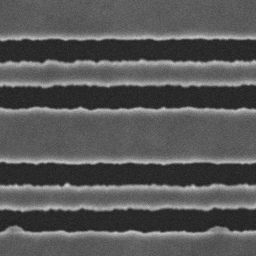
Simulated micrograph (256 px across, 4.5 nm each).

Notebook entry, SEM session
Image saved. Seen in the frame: lines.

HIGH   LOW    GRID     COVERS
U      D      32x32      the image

UUUUUUUUUUUUUUUUUUUUUUUUUUUUUUUU
UUUUUUUUUUUUUUUUUUUUUUUUUUUUUUUU
UUUUUUUUUUUUUUUUUUUUUUUUUUUUUUUU
UUUUUUUUUUUUUUUUUUUUUUUUUUUUUUUU
UUUUUUUUUUUUUUUUUUUUUUUUUUUUUUUU
DDDDDDDDDDDDDDDDDDDDDDDDDDDDDDDD
DDDDDDDDDDDDDDDDDDDDDDDDDDDDDDDD
DDDDDDDDDDDDDDDDDDDDDDDDDDDDDDDD
UUUUUUUUUUUUUUUUUUUUUUUUUUUUUUUU
UUUUUUUUUUUUUUUUUUUUUUUUUUUUUUUU
UUUUUUUUUUUUUUUUUUUUUUUUUUUUUUUU
DDDDDDDDDDDDDDDDDDDDDDDDDDDDDDDD
DDDDDDDDDDDDDDDDDDDDDDDDDDDDDDDD
DDDDUUDDDDDDDDDDDUDDDDDUDDDDDDDD
UUUUUUUUUUUUUUUUUUUUUUUUUUUUUUUU
UUUUUUUUUUUUUUUUUUUUUUUUUUUUUUUU
UUUUUUUUUUUUUUUUUUUUUUUUUUUUUUUU
UUUUUUUUUUUUUUUUUUUUUUUUUUUUUUUU
UUUUUUUUUUUUUUUUUUUUUUUUUUUUUUUU
UUUUUUUUUUUUUUUUUUUUUUUUUUUUUUUU
DDDDDDDDDUDDDDDDDDDDUDDDDDDDDDDD
DDDDDDDDDDDDDDDDDDDDDDDDDDDDDDDD
DDDDDDDDDDDDDDDDDDDDDDDDDDDDDDDD
UUUUUUUUUUUUUUUUUUUUUUUUUUUUUUUU
UUUUUUUUUUUUUUUUUUUUUUUUUUUUUUUU
UUUUUUUUUUUUUUUUUUUUUUUUUUUUUUUU
DDDDDDDDDDDDDDDDDDDDDDDDDDDDDDDD
DDDDDDDDDDDDDDDDDDDDDDDDDDDDDDDD
DUDDDDDDDDDDDDDDDDDDDDDDDDDDDDDD
UUUUUUUUUUUUUUUUUUUUUUUUUUUUUUUU
UUUUUUUUUUUUUUUUUUUUUUUUUUUUUUUU
UUUUUUUUUUUUUUUUUUUUUUUUUUUUUUUU